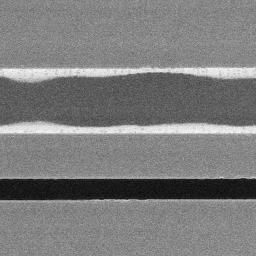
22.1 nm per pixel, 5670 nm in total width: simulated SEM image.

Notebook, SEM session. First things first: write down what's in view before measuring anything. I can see lines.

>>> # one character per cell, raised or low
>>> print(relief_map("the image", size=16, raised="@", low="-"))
@@@@@@@@@@@@@@@@
@@@@@@@@@@@@@@@@
@@@@@@@@@@@@@@@@
@@@@@@@@@@@@@@@@
-@@-------------
----------------
----------------
----------------
@@@@@@@@@@@@@@@@
@@@@@@@@@@@@@@@@
@@@@@@@@@@@@@@@@
----------------
----------------
@@@@@@@@@@@@@@@@
@@@@@@@@@@@@@@@@
@@@@@@@@@@@@@@@@